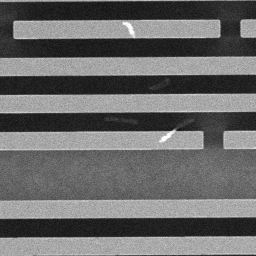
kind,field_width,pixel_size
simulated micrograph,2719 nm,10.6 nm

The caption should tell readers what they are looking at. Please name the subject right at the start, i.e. groups of lines, slits or small figures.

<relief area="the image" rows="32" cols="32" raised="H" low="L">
LLLLLLLLLLLLLLLLLLLLLLLLLLLLLLLL
LLLLLLLLLLLLLLLLLLLLLLLLLLLLLLLL
LLLLLLLLLLLLLLLLLLLLLLLLLLLLLLLL
LLHHHHHHHHHHHHHHHHHHHHHHHHHLLLHH
LLHHHHHHHHHHHHHHHHHHHHHHHHHLLLHH
LLLLLLLLLLLLLLLLLLLLLLLLLLLLLLLL
LLLLLLLLLLLLLLLLLLLLLLLLLLLLLLLL
HHHHHHHHHHHHHHHHHHHHHHHHHHHHHHHH
HHHHHHHHHHHHHHHHHHHHHHHHHHHHHHHH
LLLLLLLLLLLLLLLLLLLLLLLLLLLLLLLL
LLLLLLLLLLLLLLLLLLLLLLLLLLLLLLLL
LLLLLLLLLLLLLLLLLLLLLLLLLLLLLLLL
HHHHHHHHHHHHHHHHHHHHHHHHHHHHHHHH
HHHHHHHHHHHHHHHHHHHHHHHHHHHHHHHH
LLLLLLLLLLLLLLLLLLLLLLLLLLLLLLLL
LLLLLLLLLLLLLLLLLLLLLLLLLLLLLLLL
LLLLLLLHHHHHHHHHHHHHHHHHHLLLHHHH
HHHHHHHHHHHHHHHHHHHHHHHHHLLLHHHH
HHHHHHHHHHHHHHHHHHHHHHHHHLLLHHHH
LLLLLLLLLLLLLLLLLLLLLLLLLLLLLLLL
LLLLLLLLLLLLLLLLLLLLLLLLLLLLLLLL
LLLLLLLLLLLLLLLLLLLLLLLLLLLLLLLL
LLLLLLLLLLLLLLLLLLLLLLLLLLLLLLLL
LLLLLLLLLLLLLLLLLLLLLLLLLLLLLLLL
LLLLLLLLLLLLLLLLLLLLLLLLLLLLLLLL
HHHHHHHHHHHHHHHHHHHHHHHHHHHHHHHH
HHHHHHHHHHHHHHHHHHHHHHHHHHHHHHHH
LLLLLLLLLLLLLLLLLLLLLLLLLLLLLLLL
LLLLLLLLLLLLLLLLLLLLLLLLLLLLLLLL
LLLLLLLLLLLLLLLLLLLLLLLLLLLLLLLL
HHHHHHHHHHHHHHHHHHHHHHHHHHHHHHHH
HHHHHHHHHHHHHHHHHHHHHHHHHHHHHHHH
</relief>